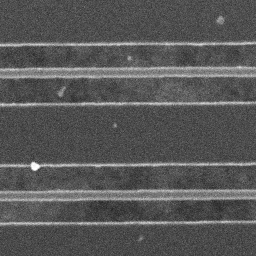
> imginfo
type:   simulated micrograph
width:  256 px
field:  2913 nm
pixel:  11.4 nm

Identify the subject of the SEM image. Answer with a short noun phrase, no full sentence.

lines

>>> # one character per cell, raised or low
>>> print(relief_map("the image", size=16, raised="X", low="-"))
XXXXXXXXXXXXXXXX
XXXXXXXXXXXXXXXX
XXXXXXXXXXXXXXXX
----------------
----------------
----------------
--XXXXXXXXXXXXXX
XXXXXXXXXXXXXXXX
XXXXXXXXXXXXXXXX
XXXXXXXXXXXXXXXX
----------------
----------------
----------------
----------------
XXXXXXXXXXXXXXXX
XXXXXXXXXXXXXXXX